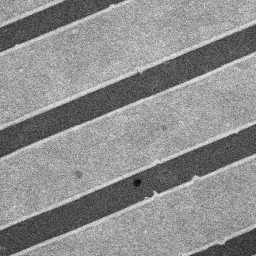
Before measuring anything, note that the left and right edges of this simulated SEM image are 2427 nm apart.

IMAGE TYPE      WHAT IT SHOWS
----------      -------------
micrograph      one or a few lines or trenches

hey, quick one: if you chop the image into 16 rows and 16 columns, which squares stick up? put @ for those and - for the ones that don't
@@@----@@@@@@@@@
-----@@@@@@@@@@@
--@@@@@@@@@@@---
@@@@@@@@@@@-----
@@@@@@@@-----@@@
@@@@@@-----@@@@@
@@@@-----@@@@@@@
@-----@@@@@@@@@@
----@@@@@@@@@@--
-@@@@@@@@@@-----
@@@@@@@@@-----@@
@@@@@@@-----@@@@
@@@@-----@@@@@@@
@@-----@@@@@@@@@
-----@@@@@@@@@@-
--@@@@@@@@@@@---